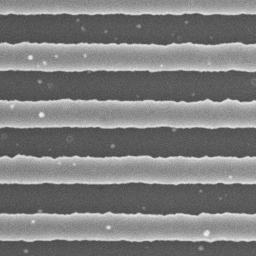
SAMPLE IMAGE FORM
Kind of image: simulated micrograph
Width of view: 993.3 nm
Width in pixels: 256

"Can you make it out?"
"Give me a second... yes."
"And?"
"lines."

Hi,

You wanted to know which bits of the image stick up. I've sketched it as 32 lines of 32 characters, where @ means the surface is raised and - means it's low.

@@@@@@@@@@@@@@@@@@@@@@@@@@@@@@@@
@@@@@@@@@@@@@@@@@@@@@@@@@@@@@@@@
--------------------------------
--------------------------------
--------------------------------
@@@@@@@@@@@@@@@@-----@@@@---@@@-
@@@@@@@@@@@@@@@@@@@@@@@@@@@@@@@@
@@@@@@@@@@@@@@@@@@@@@@@@@@@@@@@@
@@@@@@@@@@@@@@@@@@@@@@@@@@@@@@@@
--------------------------------
--------------------------------
--------------------------------
-------@@-------------------@---
@@@@@@@@@@@@@@@@@@@@@@@@@@@@@@@@
@@@@@@@@@@@@@@@@@@@@@@@@@@@@@@@@
@@@@@@@@@@@@@@@@@@@@@@@@@@@@@@@@
--------------------------------
--------------------------------
--------------------------------
--@-----------------------------
@@@@@@@@@@@@@@@@@@@@@@@@@@@@@@@@
@@@@@@@@@@@@@@@@@@@@@@@@@@@@@@@@
@@@@@@@@@@@@@@@@@@@@@@@@@@@@@@@@
--------------------------------
--------------------------------
--------------------------------
--------------------------------
@@@@@@@@@@@@@@@@@@@@@@@@@@@@@@@@
@@@@@@@@@@@@@@@@@@@@@@@@@@@@@@@@
@@@@@@@@@@@@@@@@@@@@@@@@@@@@@@@@
--------------------------------
--------------------------------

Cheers